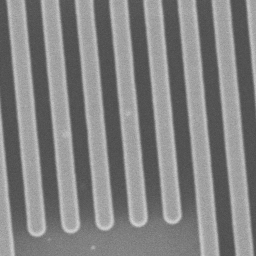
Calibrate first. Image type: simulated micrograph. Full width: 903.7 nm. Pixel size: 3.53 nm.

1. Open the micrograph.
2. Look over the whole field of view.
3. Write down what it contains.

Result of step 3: groups of lines, slits or small figures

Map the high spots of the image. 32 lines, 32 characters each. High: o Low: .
.oo..oo..ooo..oo..oo..oo...oo..o
.oo..oo..ooo..oo..oo..ooo..oo..o
.oo..ooo..oo..oo..oo...oo..oo..o
.oo..ooo..oo..oo..ooo..oo..oo..o
.ooo..oo..oo..oo..ooo..oo..oo..o
.ooo..oo..oo..oo..ooo..oo..oo..o
..oo..oo..oo..ooo..oo..oo..oo..o
..oo..oo..oo..ooo..oo..oo..oo...
..oo..oo..oo..ooo..oo..oo..oo...
..oo..oo..oo...oo..oo..oo..ooo..
..oo..oo..ooo..oo..oo..oo..ooo..
..oo..oo..ooo..oo..oo..oo...oo..
..oo..oo...oo..oo..oo..ooo..oo..
..oo..ooo..oo..oo..oo..ooo..oo..
..oo...oo..oo..oo..oo...oo..oo..
..ooo..oo..oo..oo..ooo..oo..oo..
..ooo..oo..oo..oo...oo..oo..oo..
...oo..oo..oo..ooo..oo..oo..oo..
o..oo..oo..oo..ooo..oo..oo..oo..
o..oo..oo..oo...oo..oo..oo..ooo.
o..oo..oo..ooo..oo..oo..oo..ooo.
o..oo..oo..ooo..oo..oo..oo..ooo.
o..oo..oo..ooo..oo..oo..ooo..oo.
o..oo..oo...oo..oo..oo..ooo..oo.
o..oo..ooo..oo..oo..oo..ooo..oo.
o..oo..ooo..oo..oo..oo...oo..oo.
o..oo...oo..oo..oo..ooo..oo..oo.
o..ooo..oo..oo..oo...o...oo..oo.
o...oo..oo..oo...........oo..oo.
oo.......................oo..oo.
oo.......................oo..ooo
oo.......................oo..ooo